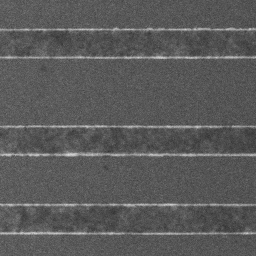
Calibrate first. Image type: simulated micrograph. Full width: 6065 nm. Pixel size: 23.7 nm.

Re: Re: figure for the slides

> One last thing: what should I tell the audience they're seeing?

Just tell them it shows lines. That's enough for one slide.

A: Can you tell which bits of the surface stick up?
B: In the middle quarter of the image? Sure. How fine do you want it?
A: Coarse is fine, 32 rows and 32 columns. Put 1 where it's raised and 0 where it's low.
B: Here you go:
00000000000000000000000000000000
00000000000000000000000000000000
00000000000000000000000000000000
00000000000000000000000000000000
00000000000000000000000000000000
00000000000000000000000000000000
00000000000000000000000000000000
00000000000000000000000000000000
00000000000000000000000000000000
00000000000000000000000000000000
00000000000000000000000000000000
00000000000000000000000000000000
00000000000000000000000000000000
00000000000000000000000000000000
00000000000000000000000000000000
00000000000000000000000000000000
11111111111111111111111111111111
11111111111111111111111111111111
11111111111111111111111111111111
11111111111111111111111111111111
11111111111111111111111111111111
11111111111111111111111111111111
11111111111111111111111111111111
00000000000000000000000000000000
00000000000000000000000000000000
00000000000000000000000000000000
00000000000000000000000000000000
00000000000000000000000000000000
00000000000000000000000000000000
00000000000000000000000000000000
00000000000000000000000000000000
00000000000000000000000000000000